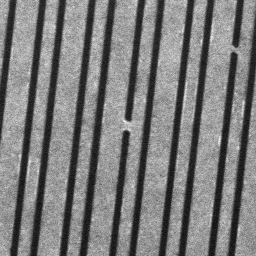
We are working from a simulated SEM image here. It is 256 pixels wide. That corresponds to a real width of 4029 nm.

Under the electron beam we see parallel lines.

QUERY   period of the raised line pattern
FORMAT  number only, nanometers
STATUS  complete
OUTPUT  387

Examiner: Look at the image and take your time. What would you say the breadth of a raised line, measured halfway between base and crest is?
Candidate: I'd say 121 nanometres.